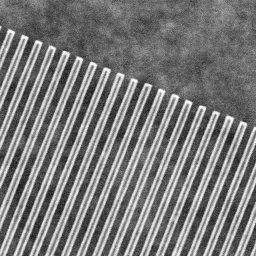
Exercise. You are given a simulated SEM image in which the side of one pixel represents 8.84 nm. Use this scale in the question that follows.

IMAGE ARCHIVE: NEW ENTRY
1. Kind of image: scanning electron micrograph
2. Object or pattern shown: parallel lines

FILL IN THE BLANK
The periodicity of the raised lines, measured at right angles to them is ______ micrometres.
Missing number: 0.13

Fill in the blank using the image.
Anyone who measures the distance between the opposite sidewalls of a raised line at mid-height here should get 46.2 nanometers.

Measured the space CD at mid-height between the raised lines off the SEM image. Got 85.2 nanometers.